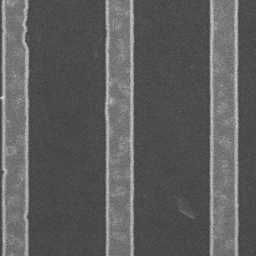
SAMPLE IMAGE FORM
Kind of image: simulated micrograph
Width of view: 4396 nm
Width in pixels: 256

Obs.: one or a few lines or trenches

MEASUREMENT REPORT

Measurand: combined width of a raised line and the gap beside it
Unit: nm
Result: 1790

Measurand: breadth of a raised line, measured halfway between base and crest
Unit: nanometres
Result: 412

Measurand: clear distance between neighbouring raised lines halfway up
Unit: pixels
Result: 80.1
